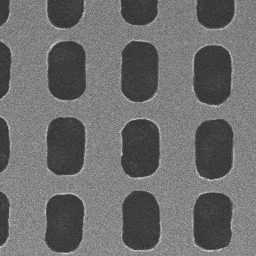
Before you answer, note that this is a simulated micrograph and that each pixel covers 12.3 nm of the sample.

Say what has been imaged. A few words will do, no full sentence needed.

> a regular array of holes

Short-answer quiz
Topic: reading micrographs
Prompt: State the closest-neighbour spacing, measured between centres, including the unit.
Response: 0.899 um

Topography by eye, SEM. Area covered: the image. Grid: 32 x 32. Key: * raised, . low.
.*****.....****.....*****....***
.*****....*****.....*****....***
.*****....******...******....***
********.*****************.*****
********************************
.******...******...*************
.*****.....****.....*****....***
.*****.....****.....****.....***
.*****.....****.....****.....***
.*****.....****.....****.....***
.*****.....****.....****.....***
.*****....*****....*****.....***
********.*******..*******...****
********************************
********************************
.*****....******...******....***
.*****.....****.....*****....***
.*****.....****.....****.....***
.*****.....****.....****.....***
.*****.....****.....****.....***
.*****....*****.....****.....***
*******...******...******....***
********************************
********************************
.******..*******...******...****
.*****....*****.....****.....***
.*****.....****.....****.....***
.*****....*****.....****.....***
.*****....*****.....****.....***
.*****....*****.....****.....***
******....******....*****....***
*******.************************